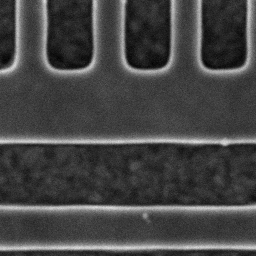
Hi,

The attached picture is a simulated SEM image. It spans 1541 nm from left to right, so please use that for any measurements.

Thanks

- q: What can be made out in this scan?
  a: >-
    groups of lines, slits or small figures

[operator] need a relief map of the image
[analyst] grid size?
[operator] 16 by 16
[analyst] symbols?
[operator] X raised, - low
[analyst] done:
-XX---XX---XX---
-XX---XX---XX---
-XX---XX---XX---
-XX---XX---XX--X
XXXXXXXXXXXXXXXX
XXXXXXXXXXXXXXXX
XXXXXXXXXXXXXXXX
XXXXXXXXXXXXXXXX
XXXXXXXXXXXXXXXX
----------------
----------------
----------------
----------------
XXXXXXXXXXXXXXXX
XXXXXXXXXXXXXXXX
XXXXXXXXX------X